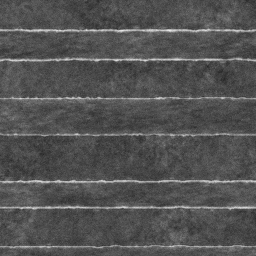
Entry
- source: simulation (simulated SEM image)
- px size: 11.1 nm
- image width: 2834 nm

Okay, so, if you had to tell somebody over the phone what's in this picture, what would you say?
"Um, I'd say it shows lines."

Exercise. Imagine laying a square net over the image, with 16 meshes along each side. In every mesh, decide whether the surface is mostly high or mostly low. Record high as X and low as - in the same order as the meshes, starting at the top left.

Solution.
----------------
----------------
XXXXXXXXXXXXXXXX
XXXXXXXXXXXXXXXX
----------------
----------------
XXXXXXXXXXXXXXXX
XXXXXXXXXXXXXXXX
----------------
----------------
----------------
XXXXXXXXXXXXXXXX
XXXXXXXXXXXXXXXX
----------------
----------------
XXXXXXXXXXXXXXXX